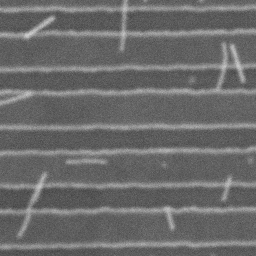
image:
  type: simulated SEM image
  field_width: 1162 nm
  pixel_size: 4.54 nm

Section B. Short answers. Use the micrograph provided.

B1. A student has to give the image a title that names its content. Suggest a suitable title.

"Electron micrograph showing lines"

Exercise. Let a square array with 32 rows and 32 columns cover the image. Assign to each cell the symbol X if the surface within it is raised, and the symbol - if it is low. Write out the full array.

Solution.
XXXXXXXXXXXXXXXXXXXXXXXXXXXXXXXX
--------------------------------
--------------------------------
--------------------------------
XXXXXXXXXXXXXXXXXXXXXXXXXXXXXXXX
XXXXXXXXXXXXXXXXXXXXXXXXXXXXXXXX
XXXXXXXXXXXXXXXXXXXXXXXXXXXXXXXX
XXXXXXXXXXXXXXXXXXXXXXXXXXXXXXXX
XXXXXXXXXXXXXXXX-XXXXX-----XXXX-
--------------------------------
--------------------------------
XXXX-X--XXXXXXXXXXXXXXXXXXXXXXXX
XXXXXXXXXXXXXXXXXXXXXXXXXXXXXXXX
XXXXXXXXXXXXXXXXXXXXXXXXXXXXXXXX
XXXXXXXXXXXXXXXXXXXXXXXXXXXXXXXX
XXXXXXXXXXXXXXXXXXXXXXXXXXXXXXXX
--------------------------------
--------------------------------
-------------------------------X
XXXXXXXXXXXXXXXXXXXXXXXXXXXXXXXX
XXXXXXXXXXXXXXXXXXXXXXXXXXXXXXXX
XXXXXXXXXXXXXXXXXXXXXXXXXXXXXXXX
XXXXXXXXXXXXXXXXXXXXXXXXXXXXXXXX
--X-X---------------------------
--------------------------------
--------------------------------
XXXXXXXXXXXXXXXXXXXXXXXXXXXXXXXX
XXXXXXXXXXXXXXXXXXXXXXXXXXXXXXXX
XXXXXXXXXXXXXXXXXXXXXXXXXXXXXXXX
XXXXXXXXXXXXXXXXXXXXXXXXXXXXXXXX
XXXXXXXXXXXXXXXXXXXXXXXXXXXXXXXX
--------------------------------